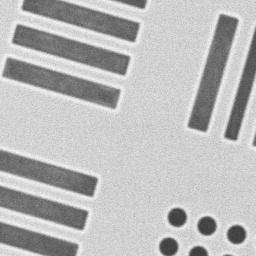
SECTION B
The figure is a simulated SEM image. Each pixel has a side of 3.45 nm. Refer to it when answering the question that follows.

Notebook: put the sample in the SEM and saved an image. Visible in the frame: groups of lines, slits or small figures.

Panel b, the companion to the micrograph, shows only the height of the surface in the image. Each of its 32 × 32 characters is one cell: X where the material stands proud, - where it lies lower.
XXX------XXXXXX---XXXXXXXXXXXXXX
XXX----------XXXXXXXXXXXXXXXXXXX
XXXXXXX---------XXXXXXXXXXX---XX
XX--XXXXXX-------XXXXXXXXXX---XX
XX-----XXXXXXX---XXXXXXXXXX--XXX
XX---------XXXXXXXXXXXXXXX---XX-
XXXXX----------XXXXXXXXXXX---XX-
X--XXXXXX-------XXXXXXXXXX--XXX-
------XXXXXX----XXXXXXXXX---XX--
---------XXXXXXXXXXXXXXXX---XX--
XXX----------XXXXXXXXXXXX---XX--
XXXXXXX--------XXXXXXXXXX--XXX-X
XXXXXXXXXX-----XXXXXXXXX---XX--X
XXXXXXXXXXXXXXXXXXXXXXXX---XX--X
XXXXXXXXXXXXXXXXXXXXXXXX--XXX-XX
XXXXXXXXXXXXXXXXXXXXXXX---XX--XX
XXXXXXXXXXXXXXXXXXXXXXXXXXXX--XX
XXXXXXXXXXXXXXXXXXXXXXXXXXXXXXXX
XXXXXXXXXXXXXXXXXXXXXXXXXXXXXXXX
---XXXXXXXXXXXXXXXXXXXXXXXXXXXXX
------XXXXXXXXXXXXXXXXXXXXXXXXXX
X---------XXXXXXXXXXXXXXXXXXXXXX
XXXX--------XXXXXXXXXXXXXXXXXXXX
-XXXXXX-----XXXXXXXXXXXXXXXXXXXX
-----XXXXXXXXXXXXXXXXXXXXXXXXXXX
--------XXXXXXXXXXXXXXXXXXXXXXXX
XX---------XXXXXXXXXX--XXXXXXXXX
XXXXXX-----XXXXXXXXXX--XX--XXXXX
---XXXXXX-XXXXXXXXXXXXXXX--XX-XX
------XXXXXXXXXXXXXXXXXXXXXX---X
---------XXXXXXXXXXX--XXXXXXX-XX
XXXX------XXXXXXXXXX--XX--XXXXXX